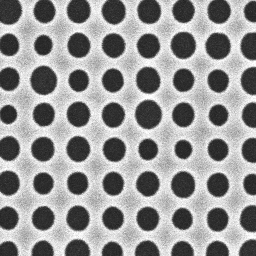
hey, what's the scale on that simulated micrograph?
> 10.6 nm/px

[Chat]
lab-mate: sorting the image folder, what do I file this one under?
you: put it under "a regular array of holes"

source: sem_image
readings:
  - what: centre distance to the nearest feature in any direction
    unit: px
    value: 34.3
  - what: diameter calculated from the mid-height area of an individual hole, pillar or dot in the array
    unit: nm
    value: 258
